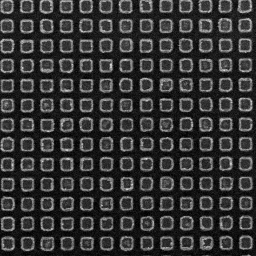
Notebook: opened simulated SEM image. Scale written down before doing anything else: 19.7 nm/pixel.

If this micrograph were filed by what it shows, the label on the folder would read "a regular array of raised bodies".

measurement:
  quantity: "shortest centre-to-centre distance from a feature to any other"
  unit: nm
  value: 384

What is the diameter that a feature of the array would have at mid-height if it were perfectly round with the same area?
0.266 um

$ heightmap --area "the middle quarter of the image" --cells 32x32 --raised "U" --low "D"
UUDDUUUDDUUUDDUUUDDUUUDDUUUDDUUU
UUDDUUUDDUUUDDUUUDDUUUDDUUUDDUUU
DDDDDDDDDDDDDDDDDDDDDDDDDDDDDDDD
DDDDDDDDDDDDDDDDDDDDDDDDDDDDDDDD
UUDDUUUDDUUUDDUUUDDUUUDDUUUDDUUU
UUDDUUUDDUUUDDUUUDDUUUDDUUUDDUUU
UUDDDUUDDUUUDDUUUDDDUDDDUUDDDUUU
DDDDDDDDDDDDDDDDDDDDDDDDDDDDDDDD
DDDDDDDDDDDDDDDDDDDDDDDDDDDDDDDD
UUDDUUUDDUUUDDUUUDDUUUDDUUUDDUUU
UUDDUUUDDUUUDDUUUDDUUUDDUUUDDUUU
UUDDUUUDDUUUDDUUUDDUUUDDUUUDDUUU
DDDDDDDDDDDDDDDDDDDDDDDDDDDDDDDD
DDDDDDDDDDDDDDDDDDDDDDDDDDDDDDUU
UUDDUUUDDUUUDDUUUDDUUUDDUUUDDUUU
UUDDUUUDDUUUDDUUUDDUUUDDUUUDDUUU
UUDDDUUDDDUUDDUUUDDUUUDDUUUDDDDD
DDDDDDDDDDDDDDDDDDDDDDDDDDDDDDDD
DDDDDDDDDDUUDDDUDDDDDDDDDUDDDDDD
UUDDUUUDDUUUDDUUUDDUUUDDUUUDDUUU
UUDDUUUDDUUUDDUUUDDUUUDDUUUDDUUU
UUDDDUUDDUUUDDDUDDDDDDDDDDDDDDDD
DDDDDDDDDDDDDDDDDDDDDDDDDDDDDDDD
DDDDDDDDDDUDDDDDDDDDDDDDDDDDDDDD
UUDDUUUDDUUUDDUUUDDUUUDDUUUDDUUU
UUDDUUUDDUUUDDUUUDDUUUDDUUUDDUUU
DDDDDDDDDDUDDDDDDDDDDDDDDDDDDDDD
DDDDDDDDDDDDDDDDDDDDDDDDDDDDDDDD
DDDDDDDDDDDDDDDDDDDDDDDDDUDDDDDD
UUDDUUUDDUUUDDUUUDDUUUDDUUUDDUUU
UUDDUUUDDUUUDDUUUDDUUUDDUUUDDUUU
DDDDDUDDDDUDDDDDDDDDDDDDDDDDDDDD